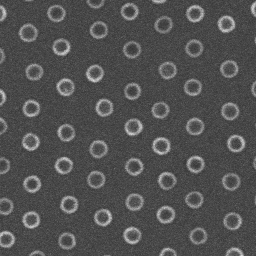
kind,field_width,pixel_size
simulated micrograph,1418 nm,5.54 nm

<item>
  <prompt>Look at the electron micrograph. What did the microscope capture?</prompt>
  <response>a regular array of raised bodies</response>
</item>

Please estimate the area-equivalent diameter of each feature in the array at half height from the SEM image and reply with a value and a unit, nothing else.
0.0901 micrometres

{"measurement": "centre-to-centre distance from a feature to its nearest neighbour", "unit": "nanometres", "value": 186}